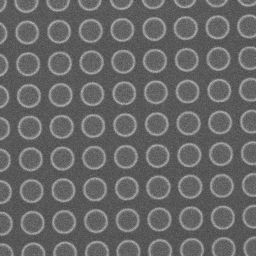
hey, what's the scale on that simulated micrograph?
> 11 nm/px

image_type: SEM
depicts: an array of small figures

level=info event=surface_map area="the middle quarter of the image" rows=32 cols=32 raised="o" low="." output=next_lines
oo..oooooo..oooooo..ooooo...oooo
o....oooo....oooo....oooo.....oo
................................
................................
......................oo.....ooo
o....oooo....oooo....oooo...oooo
oo..oooooo..oooooo..oooooo..oooo
oo..oooooo..oooooo..oooooo..oooo
oo..oooooo...ooooo..ooooo....ooo
o....oooo....oooo.....oo......oo
................................
................................
...............o......ooo.....oo
o....oooo....oooo....ooooo...ooo
oo...ooooo..oooooo..oooooo..oooo
oo..oooooo..oooooo..oooooo..oooo
oo...ooooo...ooooo...ooooo...ooo
oo...oooo.....ooo.....ooo.....oo
................................
................................
................o.....ooo.....oo
o....ooooo...ooooo...ooooo...ooo
oo...ooooo...ooooo...ooooo..oooo
oo...ooooo...ooooo...ooooo...ooo
oo...ooooo...ooooo...ooooo...ooo
oo....oooo....ooo.....ooo.....oo
................................
................................
...............oo.....ooo.....oo
oo....oooo...ooooo...ooooo...ooo
oo...ooooo...ooooo...ooooo...ooo
ooo..ooooo...ooooo...ooooo...ooo